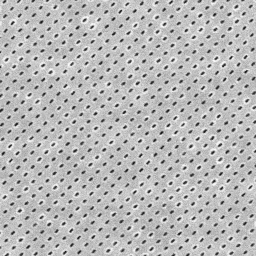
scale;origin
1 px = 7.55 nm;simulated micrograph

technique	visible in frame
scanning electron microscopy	a regular array of holes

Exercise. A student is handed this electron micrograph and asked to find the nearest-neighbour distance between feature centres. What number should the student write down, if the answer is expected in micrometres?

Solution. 0.0754